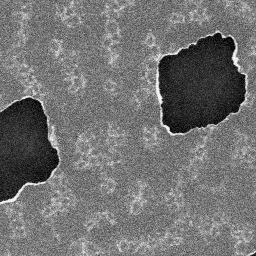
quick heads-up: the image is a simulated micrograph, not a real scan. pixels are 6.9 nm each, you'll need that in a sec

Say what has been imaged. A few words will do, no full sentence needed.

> holes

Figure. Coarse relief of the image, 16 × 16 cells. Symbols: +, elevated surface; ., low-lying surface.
++++++++++++++++
++++++++++++++++
++++++++++++..++
++++++++++.....+
++++++++++.....+
++++++++++.....+
+..+++++++.....+
...+++++++....++
...+++++++++++++
....++++++++++++
....++++++++++++
..++++++++++++++
.+++++++++++++++
++++++++++++++++
++++++++++++++++
++++++++++++++++